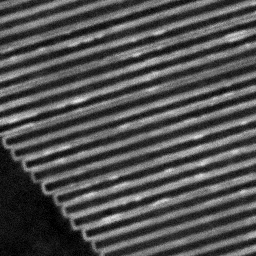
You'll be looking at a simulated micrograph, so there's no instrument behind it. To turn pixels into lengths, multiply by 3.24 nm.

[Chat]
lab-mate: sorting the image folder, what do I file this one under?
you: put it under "parallel lines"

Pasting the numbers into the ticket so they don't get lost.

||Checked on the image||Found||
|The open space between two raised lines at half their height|28.3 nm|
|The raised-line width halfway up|15.9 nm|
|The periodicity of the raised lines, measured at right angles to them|45.1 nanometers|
